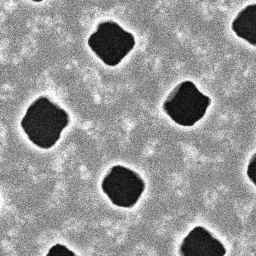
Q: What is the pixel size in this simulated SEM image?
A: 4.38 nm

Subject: holes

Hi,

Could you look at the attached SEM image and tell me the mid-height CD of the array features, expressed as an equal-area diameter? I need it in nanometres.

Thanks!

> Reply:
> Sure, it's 184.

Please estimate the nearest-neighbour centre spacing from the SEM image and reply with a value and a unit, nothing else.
435 nm